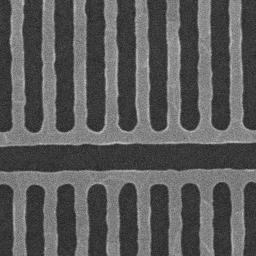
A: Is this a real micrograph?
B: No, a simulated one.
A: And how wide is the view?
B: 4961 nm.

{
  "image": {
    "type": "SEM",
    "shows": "groups of lines, slits or small figures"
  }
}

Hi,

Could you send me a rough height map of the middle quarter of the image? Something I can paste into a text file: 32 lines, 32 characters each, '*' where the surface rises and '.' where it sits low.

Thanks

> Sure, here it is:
...**......**.....***.....***...
...**......**.....***.....***...
...**......**.....***.....***...
...**......**.....***.....***...
...**......**.....***.....***...
...**......**.....***.....***...
...**......**.....***.....***...
...**......**.....***.....***...
...**......**.....***.....***...
...**......**.....***.....***...
...**......**.....***.....***...
...**......**.....***.....***...
...**......**.....***.....***...
...**......**.....***.....***...
...**......**.....***.....***...
...***....****....****....***...
..****....****...*****...*****..
********************************
********************************
********************************
................................
................................
................................
................................
................................
................................
................................
********************************
********************************
****************.**************.
..*****...*****...****....***...
...***.....***....***.....***...